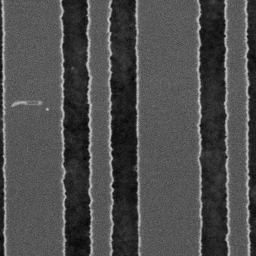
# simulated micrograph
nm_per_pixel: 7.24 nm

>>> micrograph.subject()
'lines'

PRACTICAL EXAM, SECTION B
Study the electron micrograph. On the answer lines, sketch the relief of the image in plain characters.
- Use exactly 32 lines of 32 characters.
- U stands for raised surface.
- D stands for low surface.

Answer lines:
UUUUUUUUDDDUUUDDDUUUUUUUUDDDUUUD
UUUUUUUUDDDUUUDDDUUUUUUUUDDDUUUD
UUUUUUUUDDDUUUDDDUUUUUUUUDDDUUUD
UUUUUUUUDDDUUUDDDUUUUUUUUDDDUUUD
UUUUUUUUDDDUUUDDDUUUUUUUUDDDUUUD
UUUUUUUUDDDUUUDDDUUUUUUUUDDDUUUD
UUUUUUUUDDDUUUDDDUUUUUUUUDDDUUUD
UUUUUUUUDDDUUUDDDUUUUUUUUDDDUUUD
UUUUUUUUDDDUUUDDDUUUUUUUUDDDUUUD
UUUUUUUUDDDUUUDDDUUUUUUUUDDDUUUD
UUUUUUUUDDDUUUDDDUUUUUUUUDDDUUUD
UUUUUUUUDDDUUUDDDUUUUUUUUDDDUUUD
UUUUUUUUDDDUUUDDDUUUUUUUUDDDUUUD
UUUUUUUUDDDUUUDDDUUUUUUUUDDDUUUD
UUUUUUUUDDDUUUDDDUUUUUUUUDDDUUUD
UUUUUUUUDDDUUUDDDUUUUUUUUDDDUUUD
UUUUUUUUDDDUUUDDDUUUUUUUUDDDUUUD
UUUUUUUUDDDUUUDDDUUUUUUUUDDDUUUD
UUUUUUUUDDDUUUDDDUUUUUUUUDDDUUUD
UUUUUUUUDDDUUUDDDUUUUUUUUDDDUUUD
UUUUUUUUDDDUUUDDDUUUUUUUUDDDUUUD
UUUUUUUUDDDUUUDDDUUUUUUUUDDDUUUD
DUUUUUUUDDDUUUDDDUUUUUUUUDDDUUUD
UUUUUUUUDDDUUUDDDUUUUUUUUDDDUUUD
DUUUUUUUDDDUUUDDDUUUUUUUUDDDUUUD
DUUUUUUUDDDUUUDDDUUUUUUUUDDDUUUD
DUUUUUUUDDDUUUDDDUUUUUUUUDDDUUUD
DUUUUUUUDDDUUUDDDUUUUUUUUDDDUUUD
DUUUUUUUDDDUUUDDDUUUUUUUUDDDUUUD
UUUUUUUUDDDUUUDDDUUUUUUUUDDDUUUD
UUUUUUUUDDDUUUDDDUUUUUUUUDDDUUUD
DUUUUUUUDDDUUUDDDUUUUUUUUDDDDUUD